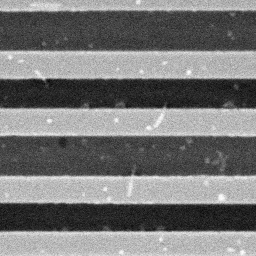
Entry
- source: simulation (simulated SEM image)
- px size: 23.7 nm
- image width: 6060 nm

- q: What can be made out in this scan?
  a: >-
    lines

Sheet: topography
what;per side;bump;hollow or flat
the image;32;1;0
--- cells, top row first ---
11111111111111111111111111111111
00000000000000000000000000000000
00000000000000000000000000000000
00000000000000000000000000000000
00000000000000000000000000000000
00000000000000000000000000000000
11111111101111111000011000000000
11111111111111111111111111111111
11111111111111111111111111111111
11111111111111111111111111111111
00000000000000000000000000000000
00000000000000000000000000000000
00000000000000000000000000000000
00000000000000000000000000000000
11111111111111111111111111111111
11111111111111111111111111111111
11111111111111111111111111111111
00000000000000000000000000000000
00000000000000000000000000000000
00000000000000000000000000000000
00000000000000000000000000000000
00000000000000000000000000000000
11111111111111111111111111111111
11111111111111111111111111111111
11111111111111111111111111111111
00000000000000000000000000000000
00000000000000000000000000000000
00000000000000000000000000000000
00000000000000000000000000000000
11111111111111111111111111111111
11111111111111111111111111111111
11111111111111111111111111111111